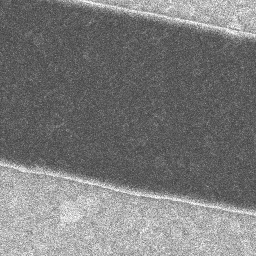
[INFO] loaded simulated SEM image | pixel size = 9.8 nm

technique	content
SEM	one or a few lines or trenches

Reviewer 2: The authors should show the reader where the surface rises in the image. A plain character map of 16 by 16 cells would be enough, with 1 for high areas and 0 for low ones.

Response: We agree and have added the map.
1111111100000000
1111111111111000
1111111111111111
1111111111111111
1111111111111111
1111111111111111
1111111111111111
1111111111111111
1111111111111111
1111111111111111
0111111111111111
0000001111111111
0000000000011111
0000000000000000
0000000000000000
0000000000000000